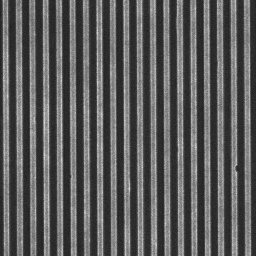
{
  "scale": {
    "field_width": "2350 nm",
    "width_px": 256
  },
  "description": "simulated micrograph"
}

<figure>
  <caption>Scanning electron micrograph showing parallel lines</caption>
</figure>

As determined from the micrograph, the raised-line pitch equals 13.4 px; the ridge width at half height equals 56.2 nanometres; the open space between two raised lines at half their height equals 64.3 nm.